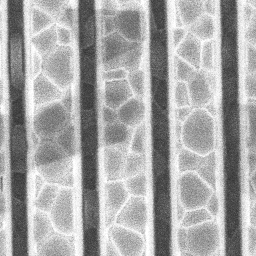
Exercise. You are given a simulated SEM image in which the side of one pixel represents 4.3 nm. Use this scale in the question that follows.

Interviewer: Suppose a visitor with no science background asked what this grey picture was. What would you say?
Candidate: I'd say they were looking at one or a few lines or trenches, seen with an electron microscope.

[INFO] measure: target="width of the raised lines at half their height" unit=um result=0.206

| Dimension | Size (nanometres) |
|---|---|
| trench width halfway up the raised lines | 99.3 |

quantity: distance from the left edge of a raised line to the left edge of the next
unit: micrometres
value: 0.307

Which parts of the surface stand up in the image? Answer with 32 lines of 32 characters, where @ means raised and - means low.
---@@@@@@---@@@@@@---@@@@@@---@@
---@@@@@@---@@@@@@---@@@@@@---@@
---@@@@@@---@@@@@@---@@@@@@---@@
@--@@@@@@---@@@@@@---@@@@@@---@@
@--@@@@@@---@@@@@@---@@@@@@---@@
@--@@@@@@---@@@@@@---@@@@@@---@@
@--@@@@@@---@@@@@@---@@@@@@---@@
@--@@@@@@---@@@@@@---@@@@@@---@@
@---@@@@@---@@@@@@---@@@@@@---@@
@---@@@@@@---@@@@@----@@@@@---@@
@---@@@@@@---@@@@@----@@@@@---@@
@---@@@@@@---@@@@@----@@@@@---@@
@---@@@@@@---@@@@@----@@@@@---@@
@---@@@@@@---@@@@@----@@@@@---@@
@---@@@@@@---@@@@@----@@@@@---@@
@---@@@@@@---@@@@@----@@@@@---@@
@---@@@@@@---@@@@@@---@@@@@---@@
@---@@@@@@---@@@@@@---@@@@@---@@
@---@@@@@@---@@@@@----@@@@@---@@
@---@@@@@@---@@@@@----@@@@@---@@
@---@@@@@@---@@@@@@---@@@@@@---@
@---@@@@@@---@@@@@@---@@@@@@---@
@---@@@@@@---@@@@@@---@@@@@@---@
@---@@@@@@---@@@@@@---@@@@@@---@
@---@@@@@@---@@@@@@---@@@@@@---@
@---@@@@@@---@@@@@@---@@@@@@---@
@---@@@@@@---@@@@@@---@@@@@@---@
@---@@@@@@---@@@@@@---@@@@@@---@
@---@@@@@@---@@@@@@---@@@@@@---@
@---@@@@@@---@@@@@@---@@@@@@---@
@---@@@@@@---@@@@@@---@@@@@@---@
@---@@@@@@---@@@@@@---@@@@@@---@